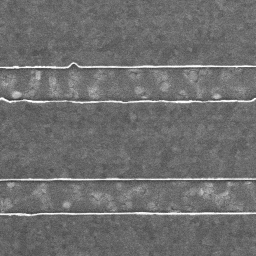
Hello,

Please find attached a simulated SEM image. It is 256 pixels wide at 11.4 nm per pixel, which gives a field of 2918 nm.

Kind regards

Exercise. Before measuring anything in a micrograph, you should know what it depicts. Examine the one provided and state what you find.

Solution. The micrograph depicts one or a few lines or trenches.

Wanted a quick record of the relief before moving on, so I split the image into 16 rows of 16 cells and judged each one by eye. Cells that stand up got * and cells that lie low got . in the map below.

****************
****************
****************
****************
................
................
****************
****************
****************
****************
****************
................
................
****************
****************
****************